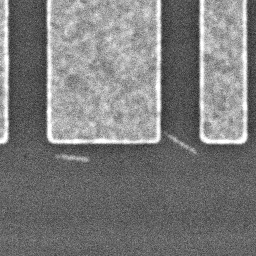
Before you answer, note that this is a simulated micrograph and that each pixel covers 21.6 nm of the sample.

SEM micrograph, wiring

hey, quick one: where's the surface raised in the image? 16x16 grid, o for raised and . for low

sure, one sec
...ooooooo...oo.
...ooooooo...oo.
...ooooooo...oo.
...ooooooo...oo.
...ooooooo...oo.
...ooooooo...oo.
...ooooooo...oo.
...ooooooo...oo.
...ooooooo...oo.
................
................
................
................
................
................
................